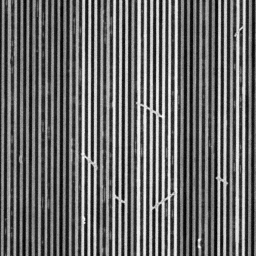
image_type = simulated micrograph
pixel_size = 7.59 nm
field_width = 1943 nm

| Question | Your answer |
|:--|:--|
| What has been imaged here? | parallel lines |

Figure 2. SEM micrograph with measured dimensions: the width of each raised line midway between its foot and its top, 19 nm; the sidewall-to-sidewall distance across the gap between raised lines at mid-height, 26.6 nm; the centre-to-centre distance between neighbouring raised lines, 47 nm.